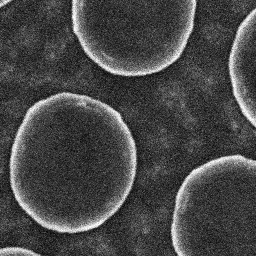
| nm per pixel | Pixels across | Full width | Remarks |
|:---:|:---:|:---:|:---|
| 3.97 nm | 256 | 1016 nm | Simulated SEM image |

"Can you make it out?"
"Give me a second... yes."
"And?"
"raised bodies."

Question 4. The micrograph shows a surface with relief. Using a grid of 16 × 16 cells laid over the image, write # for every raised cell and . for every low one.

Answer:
.....#######....
.....#######...#
.....#######...#
......#####...##
.......###....##
...............#
..####.........#
..######........
.#######........
.#######........
.#######.....###
.#######...#####
.#######...#####
..#####....#####
...........#####
...........#####